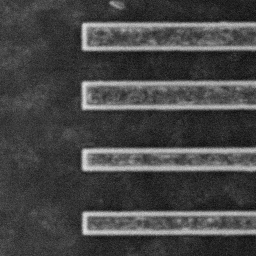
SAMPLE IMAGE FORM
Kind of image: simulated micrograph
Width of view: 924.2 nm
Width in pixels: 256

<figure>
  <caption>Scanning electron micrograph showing one or a few lines or trenches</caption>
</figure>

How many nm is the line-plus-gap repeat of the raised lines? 224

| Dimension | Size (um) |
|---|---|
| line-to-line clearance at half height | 0.159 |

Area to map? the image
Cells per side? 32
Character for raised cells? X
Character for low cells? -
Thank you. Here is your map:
--------------------------------
--------------------------------
--------------------------------
-----------XXXXXXXXXXXXXXXXXXXXX
-----------XXXXXXXXXXXXXXXXXXXXX
-----------XXXXXXXXXXXXXXXXXXXXX
--------------------------------
--------------------------------
--------------------------------
--------------------------------
-----------XXXXXXXXXXXXXXXXXXXXX
-----------XXXXXXXXXXXXXXXXXXXXX
-----------XXXXXXXXXXXXXXXXXXXXX
--------------------------------
--------------------------------
--------------------------------
--------------------------------
--------------------------------
--------------------------------
-----------XXXXXXXXXXXXXXXXXXXXX
-----------XXXXXXXXXXXXXXXXXXXXX
--------------------------------
--------------------------------
--------------------------------
--------------------------------
--------------------------------
--------------------------------
-----------XXXXXXXXXXXXXXXXXXXXX
-----------XXXXXXXXXXXXXXXXXXXXX
--------------------------------
--------------------------------
--------------------------------